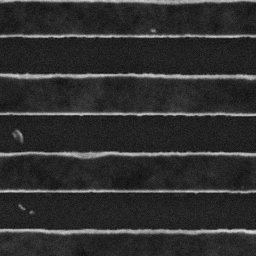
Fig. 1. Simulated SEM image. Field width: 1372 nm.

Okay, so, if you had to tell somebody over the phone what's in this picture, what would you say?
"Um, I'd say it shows lines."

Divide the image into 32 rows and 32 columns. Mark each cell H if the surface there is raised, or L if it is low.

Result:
HHHHHHHHHHHHHHHHHHHHHHHHHHHHHHHH
HHHHHHHHHHHHHHHHHHHHHHHHHHHHHHHH
HHHHHHHHHHHHHHHHHHHHHHHHHHHHHHHH
HHHHHHHHHHHHHHHHHHHHHHHHHHHHHHHH
HHHHHHHHHHHHHHHHHHHHHHHHHHHHHHHH
LLLLLLLLLLLLLLLLLLLLLLLLLLLLLLLL
LLLLLLLLLLLLLLLLLLLLLLLLLLLLLLLL
LLLLLLLLLLLLLLLLLLLLLLLLLLLLLLLL
LLLLLLLLLLLLLLLLLLLLLLLLLLLLLLLL
HHHHLHHHHHHHHHHHHHHHHLLLLLLLLLLL
HHHHHHHHHHHHHHHHHHHHHHHHHHHHHHHH
HHHHHHHHHHHHHHHHHHHHHHHHHHHHHHHH
HHHHHHHHHHHHHHHHHHHHHHHHHHHHHHHH
HHHHHHHHHHHHHHHHHHHHHHHHHHHHHHHH
LLLLLLLLLLLLLLLLLLLLLLLLLLLLLLLL
LLLLLLLLLLLLLLLLLLLLLLLLLLLLLLLL
LLLLLLLLLLLLLLLLLLLLLLLLLLLLLLLL
LLLLLLLLLLLLLLLLLLLLLLLLLLLLLLLL
LLLLLLLLLLLLLLLLLLLLLLLLLLLLLLLL
HHHHHHHHHHHHHHHHHHHHHHHHHHHHHHHH
HHHHHHHHHHHHHHHHHHHHHHHHHHHHHHHH
HHHHHHHHHHHHHHHHHHHHHHHHHHHHHHHH
HHHHHHHHHHHHHHHHHHHHHHHHHHHHHHHH
HHHHHHHHHHHHHHHHHHHHHHHHHHHHHHHH
LLLLLLLLLLLLLLLLLLLLLLLLLLLLLLLL
LLLLLLLLLLLLLLLLLLLLLLLLLLLLLLLL
LLLLLLLLLLLLLLLLLLLLLLLLLLLLLLLL
LLLLLLLLLLLLLLLLLLLLLLLLLLLLLLLL
LLLLLLLLLLLLLLLLLLLLLLLLLLLLLLLL
HHHHHHHHHHHHHHHHHHHHHHHHHHHHHHHH
HHHHHHHHHHHHHHHHHHHHHHHHHHHHHHHH
HHHHHHHHHHHHHHHHHHHHHHHHHHHHHHHH